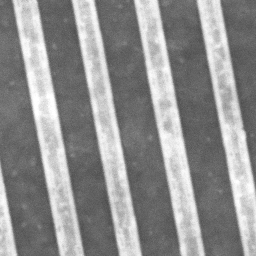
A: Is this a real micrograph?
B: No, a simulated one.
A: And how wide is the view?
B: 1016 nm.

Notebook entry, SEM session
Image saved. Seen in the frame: one or a few lines or trenches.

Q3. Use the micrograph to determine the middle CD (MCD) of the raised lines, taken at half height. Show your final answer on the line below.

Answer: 66.9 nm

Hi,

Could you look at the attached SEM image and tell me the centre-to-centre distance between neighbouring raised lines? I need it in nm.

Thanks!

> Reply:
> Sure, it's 239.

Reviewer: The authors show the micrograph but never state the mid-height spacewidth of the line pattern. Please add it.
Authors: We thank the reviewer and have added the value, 177 nm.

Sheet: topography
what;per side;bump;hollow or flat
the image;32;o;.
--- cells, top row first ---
..ooo....oo......oo......oo.....
..ooo.....oo.....ooo.....oo.....
..ooo.....oo......oo......oo....
...oo.....oo......oo......oo....
...oo.....oo......oo......oo....
...oo.....oo......oo......oo....
...oo......oo.....ooo.....oo....
...ooo.....oo......oo.....oo....
....oo.....oo......oo......oo...
....oo.....oo......oo......oo...
....oo.....oo......oo......oo...
....oo......oo.....oo......oo...
....ooo.....oo.....ooo.....oo...
....ooo.....oo......oo......oo..
.....oo.....oo......oo......oo..
.....oo.....oo......oo......oo..
.....oo.....oo......oo......oo..
.....oo......oo.....ooo.....oo..
.....ooo.....oo......oo.....ooo.
......oo.....oo......oo......oo.
......oo.....oo......oo......oo.
......oo.....ooo.....oo......oo.
......oo......oo.....oo......oo.
......ooo.....oo......oo.....oo.
.......oo.....oo......oo......oo
o......oo.....oo......oo......oo
o......oo.....oo......oo......oo
o......oo.....oo......oo......oo
o......ooo.....oo.....ooo.....oo
o......ooo.....oo......oo......o
o......ooo.....oo......oo......o
oo......oo.....oo......oo......o